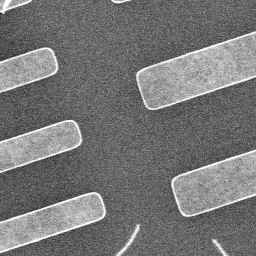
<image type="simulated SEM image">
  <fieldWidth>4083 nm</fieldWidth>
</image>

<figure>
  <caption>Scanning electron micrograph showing groups of lines, slits or small figures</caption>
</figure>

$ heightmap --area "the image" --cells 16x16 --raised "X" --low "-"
X---------------
----------------
--------------XX
-XX--------XXXXX
XXX------XXXXXXX
X--------XXXXX--
---------XX-----
----------------
-XXXX-----------
XXXX------------
X------------XXX
-----------XXXXX
----XX-----XXXX-
-XXXXX----------
XXXX------------
X---------------